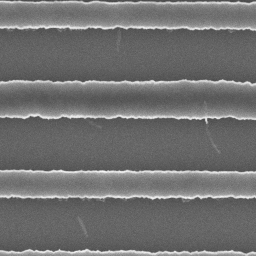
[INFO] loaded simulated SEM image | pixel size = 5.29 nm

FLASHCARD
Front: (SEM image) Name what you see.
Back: lines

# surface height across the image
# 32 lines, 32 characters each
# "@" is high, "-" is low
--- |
@@@@@@@@@@@@@@@@@@@@@@@@@@@@@@@@
@@@@@@@@@@@@@@@@@@@@@@@@@@@@@@@@
@@@@@@@@@@@@@@@@@@@@@@@@@@@@@@@@
@@@@@@-@@@@@@@-@-@@@@@@@@@@@@@@@
--------------------------------
--------------------------------
--------------------------------
--------------------------------
--------------------------------
--------------------------------
@@@@@@@@@@@@@@@@@@@@@@@@@@@@@@@@
@@@@@@@@@@@@@@@@@@@@@@@@@@@@@@@@
@@@@@@@@@@@@@@@@@@@@@@@@@@@@@@@@
@@@@@@@@@@@@@@@@@@@@@@@@@@@@@@@@
@@@@@@@@@@@@@@@@@@@@@@@@@@@@@@@@
--------------------------------
--------------------------------
--------------------------------
--------------------------------
--------------------------------
--------------------------------
@@@@@@@@@@@@@@@@@@@@@@@@@@@@@@@@
@@@@@@@@@@@@@@@@@@@@@@@@@@@@@@@@
@@@@@@@@@@@@@@@@@@@@@@@@@@@@@@@@
@@@@@@@@@@@@@@@@@@@@@@@@@@@@@@@@
--------------------------------
--------------------------------
--------------------------------
--------------------------------
--------------------------------
--------------------------------
@@-@@@@@@@@@@@@@@@--@@@-@@-@@@--